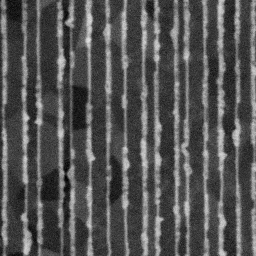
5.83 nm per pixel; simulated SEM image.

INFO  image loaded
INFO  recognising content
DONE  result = parallel lines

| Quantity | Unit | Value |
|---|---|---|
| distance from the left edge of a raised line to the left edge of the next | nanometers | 193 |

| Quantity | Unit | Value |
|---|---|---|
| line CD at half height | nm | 111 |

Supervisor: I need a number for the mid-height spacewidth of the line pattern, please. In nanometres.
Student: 88.1